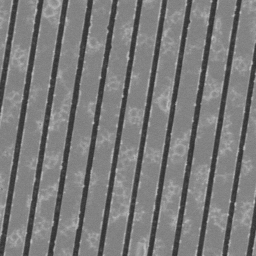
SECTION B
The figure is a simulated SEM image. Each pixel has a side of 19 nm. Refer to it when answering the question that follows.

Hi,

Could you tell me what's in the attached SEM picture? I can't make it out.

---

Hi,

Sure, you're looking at parallel lines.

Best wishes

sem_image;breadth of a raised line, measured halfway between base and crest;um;0.365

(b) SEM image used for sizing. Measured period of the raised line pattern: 464 nm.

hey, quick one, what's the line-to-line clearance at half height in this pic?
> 103 nm